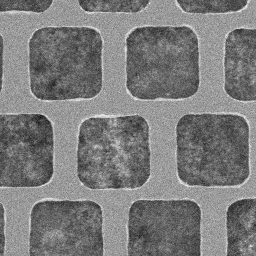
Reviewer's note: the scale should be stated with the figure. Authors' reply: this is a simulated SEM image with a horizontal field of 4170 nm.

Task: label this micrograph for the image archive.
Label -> holes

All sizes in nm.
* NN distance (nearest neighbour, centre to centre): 1600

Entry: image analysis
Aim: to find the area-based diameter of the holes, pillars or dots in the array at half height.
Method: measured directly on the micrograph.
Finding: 1310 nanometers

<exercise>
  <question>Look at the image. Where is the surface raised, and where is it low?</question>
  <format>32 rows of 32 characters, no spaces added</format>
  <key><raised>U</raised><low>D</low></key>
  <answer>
DDDDDDUUUUDDDDDDDDUUUUDDDDDDDDDU
DUUUDUUUUUUUDDDDDUUUUUUDDDDDDUUU
UUUUUUUUUUUUUUUUUUUUUUUUUUUUUUUU
UUUUUUDDDDDUUUUUUDDDDDDDUUUUUUUU
UUUUDDDDDDDDDUUUDDDDDDDDDUUUDDDD
UUUUDDDDDDDDDUUUDDDDDDDDDUUUDDDD
UUUUDDDDDDDDDUUUDDDDDDDDDUUUDDDD
UUUUDDDDDDDDDUUUDDDDDDDDDUUUDDDD
UUUUDDDDDDDDDUUUDDDDDDDDDUUUDDDD
UUUUDDDDDDDDDUUUDDDDDDDDDUUUDDDD
UUUUDDDDDDDDDUUUDDDDDDDDDUUUDDDD
UUUUDDDDDDDDDUUUDDDDDDDDDUUUDDDD
UUUUUDDDDUUUUUUUUUUDUUUUUUUUUDDD
UUUUUUUUUUUUUUUUUUUUUUUUUUUUUUUU
DDDDDDUUUUUUUUUUDUUUUUUDDDDDDDUU
DDDDDDUUUUDDDDDDDDUUUUDDDDDDDDDU
DDDDDDDUUUDDDDDDDDDUUUDDDDDDDDDU
DDDDDDDUUUDDDDDDDDDUUUDDDDDDDDDU
DDDDDDDUUUDDDDDDDDDUUUDDDDDDDDDU
DDDDDDDUUUDDDDDDDDDUUUDDDDDDDDDU
DDDDDDDUUUDDDDDDDDDUUUDDDDDDDDDU
DDDDDDDUUUDDDDDDDDDUUUDDDDDDDDDU
DDDDDDUUUUDDDDDDDDUUUUUDDDDDDDDU
UUUUUUUUUUUDDDDDDUUUUUUUUUUUUUUU
UUUUUUUUUUUUUUUUUUUUUUUUUUUUUUUU
UUUUDDDDDDDDUUUUUDDDDDDDDUUUUDDD
DUUUDDDDDDDDDUUUDDDDDDDDDUUUDDDD
DUUUDDDDDDDDDUUUDDDDDDDDDUUUDDDD
DUUUDDDDDDDDDUUUDDDDDDDDDUUUDDDD
DUUUDDDDDDDDDUUUDDDDDDDDDUUUDDDD
DUUUDDDDDDDDDUUUDDDDDDDDDUUUDDDD
DUUUDDDDDDDDDUUUDDDDDDDDDUUUDDDD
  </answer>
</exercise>